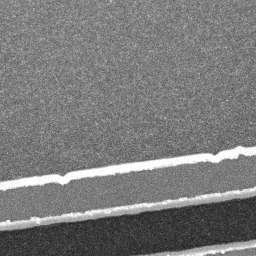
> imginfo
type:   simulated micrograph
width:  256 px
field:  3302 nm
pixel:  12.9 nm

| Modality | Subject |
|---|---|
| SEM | one or a few lines or trenches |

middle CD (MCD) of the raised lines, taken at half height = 537 nm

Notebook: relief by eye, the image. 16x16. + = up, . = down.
................
................
................
................
................
................
................
................
................
...............+
........++++++++
.+++++++++++++++
+++++++++++++...
+++++...........
................
..............++